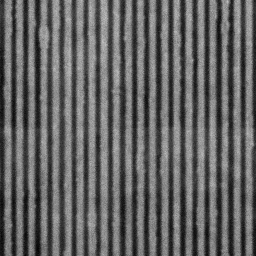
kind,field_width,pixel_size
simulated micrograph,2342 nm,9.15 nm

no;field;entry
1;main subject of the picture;parallel lines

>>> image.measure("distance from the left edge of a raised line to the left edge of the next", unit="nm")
110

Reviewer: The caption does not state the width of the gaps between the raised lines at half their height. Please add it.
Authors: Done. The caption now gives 57.2 nm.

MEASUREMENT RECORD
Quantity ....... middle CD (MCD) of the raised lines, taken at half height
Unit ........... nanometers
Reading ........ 50.3